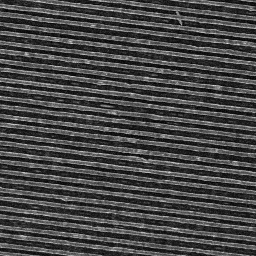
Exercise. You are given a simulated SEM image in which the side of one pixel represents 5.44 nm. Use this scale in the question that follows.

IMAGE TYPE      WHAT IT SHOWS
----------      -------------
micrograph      parallel lines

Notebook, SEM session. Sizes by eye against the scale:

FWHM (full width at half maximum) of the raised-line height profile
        19.6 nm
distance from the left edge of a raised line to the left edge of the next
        49.7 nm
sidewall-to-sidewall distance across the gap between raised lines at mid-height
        29.7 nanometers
